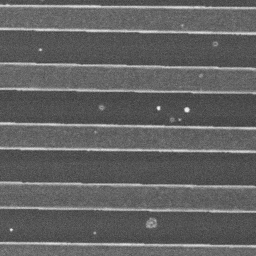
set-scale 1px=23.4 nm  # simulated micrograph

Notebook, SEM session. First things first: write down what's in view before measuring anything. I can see lines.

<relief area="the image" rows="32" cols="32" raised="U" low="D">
DDDDDDDDDDDDDDDDDDDDDDDDDDDDDDDD
UUUUUUUUUUUUUUUUUUUUUUUUUUUUUUUU
UUUUUUUUUUUUUUUUUUUUUUUUUUUUUUUU
UUUUUUUUUUUUUUUUUUUUUUUUUUUUUUUU
DDDDDDDDDDDDDDDDDDDDDDDDDDDDDDDD
DDDDDDDDDDDDDDDDDDDDDDDDDDDDDDDD
DDDDDDDDDDDDDDDDDDDDDDDDDDDDDDDD
DDDDDDDDDDDDDDDDDDDDDDDDDDDDDDDD
UUUUUUUUUUUUUUUUUUUUUUUUUDDDDDDD
UUUUUUUUUUUUUUUUUUUUUUUUUUUUUUUU
UUUUUUUUUUUUUUUUUUUUUUUUUUUUUUUU
DDDDDDDDDDDDDDDDDDDDDDDDDDUUUUUU
DDDDDDDDDDDDDDDDDDDDDDDDDDDDDDDD
DDDDDDDDDDDDDDDDDDDDDDDDDDDDDDDD
DDDDDDDDDDDDDDDDDDDDDDDDDDDDDDDD
UUUUUDDDDDDDDDDDDDDDDDDDDDDDDDDD
UUUUUUUUUUUUUUUUUUUUUUUUUUUUUUUU
UUUUUUUUUUUUUUUUUUUUUUUUUUUUUUUU
UUUUUUUUUUUUUUUUUUUUUUUUUUUUUUUU
DDDDDDDDDDDDDDDDDDDDDDDDDDDDDDDD
DDDDDDDDDDDDDDDDDDDDDDDDDDDDDDDD
DDDDDDDDDDDDDDDDDDDDDDDDDDDDDDDD
DDDDDDDDDDDDDDDDDDDDDDDDDDDDDDDD
UUUUUUUUUUUUUUUUUUUUUUUUUUUUUUUU
UUUUUUUUUUUUUUUUUUUUUUUUUUUUUUUU
UUUUUUUUUUUUUUUUUUUUUUUUUUUUUUUU
DDDDDDDDDDDDDDDDDDDDDDDDDDDDDDDD
DDDDDDDDDDDDDDDDDDDDDDDDDDDDDDDD
DDDDDDDDDDDDDDDDDDDDDDDDDDDDDDDD
DDDDDDDDDDDDDDDDDDDDDDDDDDDDDDDD
UUUUUUUUUUUUDDDDDDDDDDDDDDDDDDDD
UUUUUUUUUUUUUUUUUUUUUUUUUUUUUUUU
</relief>